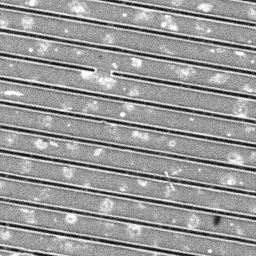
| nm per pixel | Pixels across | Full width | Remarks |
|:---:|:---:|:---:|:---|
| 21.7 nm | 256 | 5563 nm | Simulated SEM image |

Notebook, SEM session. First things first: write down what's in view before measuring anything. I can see parallel lines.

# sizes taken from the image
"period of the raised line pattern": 518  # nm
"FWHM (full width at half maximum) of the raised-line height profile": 0.11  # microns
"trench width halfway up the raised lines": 18.5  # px